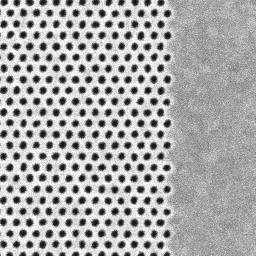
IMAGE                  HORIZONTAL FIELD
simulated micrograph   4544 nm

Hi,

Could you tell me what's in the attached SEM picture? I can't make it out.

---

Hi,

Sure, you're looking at a regular array of holes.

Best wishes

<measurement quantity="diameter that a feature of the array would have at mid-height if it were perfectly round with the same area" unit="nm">144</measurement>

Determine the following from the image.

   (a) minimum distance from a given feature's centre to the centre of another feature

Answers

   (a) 220 nanometres